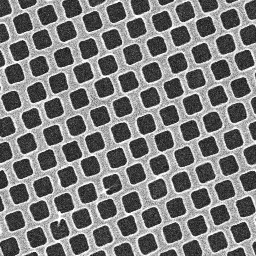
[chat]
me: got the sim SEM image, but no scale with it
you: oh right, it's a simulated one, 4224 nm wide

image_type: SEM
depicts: a regular array of holes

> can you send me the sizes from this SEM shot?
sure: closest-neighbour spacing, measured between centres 408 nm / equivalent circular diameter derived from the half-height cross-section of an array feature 328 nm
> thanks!